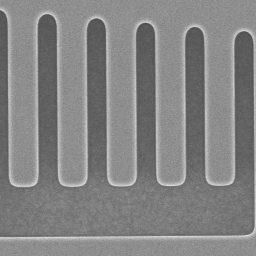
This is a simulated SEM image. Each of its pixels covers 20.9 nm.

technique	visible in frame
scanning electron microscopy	groups of lines, slits or small figures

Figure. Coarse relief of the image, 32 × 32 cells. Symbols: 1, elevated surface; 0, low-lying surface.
11111111111111111111111111111111
11111111111111111111111111111111
01111001111001111111111111111111
01111001111001111001111101111111
01111001111001111001111001111101
01111001111001111001111000111000
01111001111001111001111000111000
01111001111001111001111000111000
01111001111001111000111000111000
01111001111001111000111000111000
01111001111001111000111000111000
01111001111001111000111000111000
01111001111001111000111000111000
01111001111001111000111000111000
01111001111001111000111000111000
01111001111001111000111000111000
01111001111001111000111000111000
01111001111001111000111000111000
01111001111001111000111000111000
01111001111001111000111000111000
01111001111001111000111000111000
01111001111001111000111000111000
01111001111000111000111000111000
00000000000000000000000000000000
00000000000000000000000000000000
00000000000000000000000000000000
00000000000000000000000000000000
00000000000000000000000000000000
00000000000000000000000000000000
00000000000000000000000000000011
11111111111111111111111111111111
11111111111111111111111111111111